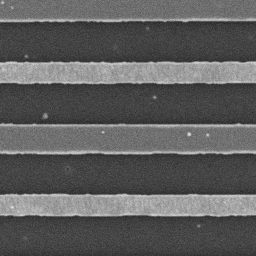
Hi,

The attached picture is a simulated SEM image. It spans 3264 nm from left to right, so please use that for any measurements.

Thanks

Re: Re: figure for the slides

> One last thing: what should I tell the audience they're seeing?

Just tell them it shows lines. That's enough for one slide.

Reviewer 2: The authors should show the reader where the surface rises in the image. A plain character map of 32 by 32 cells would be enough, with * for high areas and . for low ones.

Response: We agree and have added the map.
********************************
********************************
********************************
................................
................................
................................
................................
................................
********************************
********************************
................................
................................
................................
................................
................................
................................
********************************
********************************
********************************
................................
................................
................................
................................
................................
********************************
********************************
********************************
................................
................................
................................
................................
................................